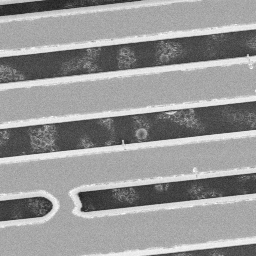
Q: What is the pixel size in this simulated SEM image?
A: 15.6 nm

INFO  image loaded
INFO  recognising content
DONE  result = one or a few lines or trenches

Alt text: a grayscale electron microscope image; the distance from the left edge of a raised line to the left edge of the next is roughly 1.09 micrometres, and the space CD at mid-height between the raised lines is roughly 500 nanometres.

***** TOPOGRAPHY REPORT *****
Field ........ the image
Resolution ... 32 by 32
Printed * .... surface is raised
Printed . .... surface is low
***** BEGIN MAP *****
.................***************
........************************
********************************
******************************..
*********************...........
************....................
***.............................
..............................**
......................**********
.............*******************
....****************************
********************************
******************************..
*********************...........
************....................
***.............................
................................
........................********
...............*****************
.....***************************
********************************
******************************..
*********************...........
************....................
***...***.......................
.......***.............*********
.......***....******************
.....***************************
********************************
********************************
*****************************...
*******************.............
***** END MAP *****